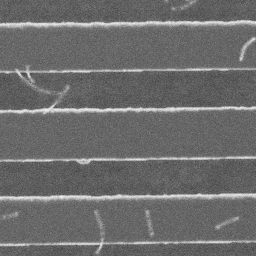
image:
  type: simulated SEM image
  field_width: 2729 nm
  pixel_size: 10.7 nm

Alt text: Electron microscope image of lines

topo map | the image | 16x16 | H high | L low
LLLLLLLLLLLLLLLL
HHHHHHHHHHHHHHHH
HHHHHHHHHHHHHHHH
HHHHHHHHHHHHHHHH
HHLLLLLLLLLLLLLL
LLLLLLLLLLLLLLLL
LLLLLLLLLLLLLLLL
HHHHHHHHHHHHHHHH
HHHHHHHHHHHHHHHH
HHHHHHHHHHHHHHHH
LLLLLLLLLLLLLLLL
LLLLLLLLLLLLLLLL
HHHHHHHHHHHHHHHH
HHHHHHHHHHHHHHHH
HHHHHHHHHHHHHHHH
LLLLLLLLLLLLLLLL